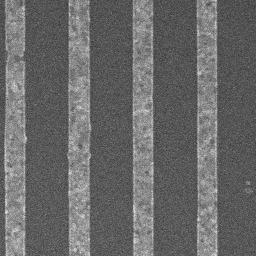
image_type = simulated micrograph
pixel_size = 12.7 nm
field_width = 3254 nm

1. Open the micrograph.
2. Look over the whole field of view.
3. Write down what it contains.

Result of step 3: one or a few lines or trenches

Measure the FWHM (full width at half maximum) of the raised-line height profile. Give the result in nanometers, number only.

235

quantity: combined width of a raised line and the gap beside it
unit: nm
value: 813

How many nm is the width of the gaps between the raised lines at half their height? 567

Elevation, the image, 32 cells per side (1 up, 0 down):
01100000011000000110000001100000
01100000011000000110000001100000
01100000011000000110000001100000
01100000011000000110000001100000
01100000011000000110000001100000
01100000011000000110000001100000
01100000011000000110000001100000
01100000011000000110000001100000
01100000011000000110000001100000
01100000011000000110000001100000
01100000011000000110000001100000
01100000011000000110000001100000
01100000011000000110000001100000
01100000011000000110000001100000
01100000011000000110000001100000
01100000011000000110000001100000
01100000011000000110000001100000
01100000011000000110000001100000
01100000011000000110000001100000
01100000011000000110000001100000
01100000011000000110000001100000
01100000011000000110000001100000
01100000011000000110000001100000
01100000011000000110000001100000
01100000011000000110000001100000
01100000011000000110000001100000
01100000011000000110000001100000
01100000011000000110000001100000
01100000011000000110000001100000
01100000011000000110000001100000
01100000011000000110000001100000
01100000011000000110000001100000